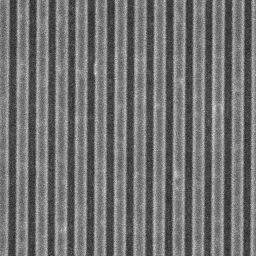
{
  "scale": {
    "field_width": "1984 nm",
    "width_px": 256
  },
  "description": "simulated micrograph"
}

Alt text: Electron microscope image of parallel lines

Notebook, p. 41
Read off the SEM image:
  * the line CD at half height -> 84.2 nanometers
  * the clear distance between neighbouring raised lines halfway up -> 8.86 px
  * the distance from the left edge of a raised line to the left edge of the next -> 151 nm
